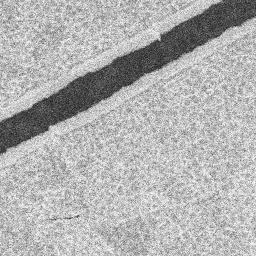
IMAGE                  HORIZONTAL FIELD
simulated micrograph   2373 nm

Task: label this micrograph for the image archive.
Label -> one or a few lines or trenches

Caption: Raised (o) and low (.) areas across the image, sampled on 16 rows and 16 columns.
oooooooooooo....
oooooooooo......
ooooooooo.....oo
ooooooo.....oooo
ooooo.....oooooo
ooo......ooooooo
o......ooooooooo
.....ooooooooooo
...ooooooooooooo
.ooooooooooooooo
oooooooooooooooo
oooooooooooooooo
oooooooooooooooo
oooooooooooooooo
oooooooooooooooo
oooooooooooooooo